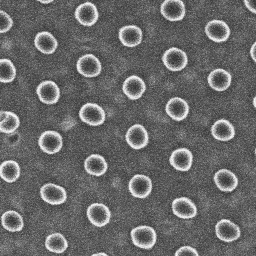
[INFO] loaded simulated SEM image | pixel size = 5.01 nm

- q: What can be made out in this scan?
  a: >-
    a regular array of raised bodies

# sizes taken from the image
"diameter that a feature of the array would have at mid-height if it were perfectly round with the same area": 107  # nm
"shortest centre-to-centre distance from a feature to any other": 245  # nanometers